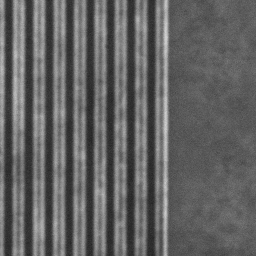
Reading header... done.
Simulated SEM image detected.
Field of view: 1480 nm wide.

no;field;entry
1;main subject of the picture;parallel lines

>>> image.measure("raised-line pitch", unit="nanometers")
118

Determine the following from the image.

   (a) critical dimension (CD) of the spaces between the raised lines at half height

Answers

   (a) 70 nm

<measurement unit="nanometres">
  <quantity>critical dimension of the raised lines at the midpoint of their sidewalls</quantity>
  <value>49.8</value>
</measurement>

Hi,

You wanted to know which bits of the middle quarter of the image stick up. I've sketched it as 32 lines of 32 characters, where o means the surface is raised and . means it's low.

...oo...oo...oo...oo...oo.......
...oo...oo...oo...oo...oo.......
...oo...oo...oo...oo...oo.......
...oo...oo...oo...oo...oo.......
...oo...oo...oo...oo...oo.......
...oo...oo...oo...oo...oo.......
...oo...oo...oo...oo...oo.......
...oo...oo...oo...oo...oo.......
...oo...oo...oo...oo...oo.......
...oo...oo...oo...oo...oo.......
...oo...oo...oo...oo...oo.......
...oo...oo...oo...oo...oo.......
...oo...oo...oo...oo...oo.......
...oo...oo...oo...oo...oo.......
...oo...oo...oo...oo...oo.......
...oo...oo...oo...oo...oo.......
...oo...oo...oo...oo...oo.......
...oo...oo...oo...oo...oo.......
...oo...oo...oo...oo...oo.......
...oo...oo...oo...oo...oo.......
...oo...oo...oo...oo...oo.......
...oo...oo...oo...oo...oo.......
...oo...oo...oo...oo...oo.......
...oo...oo...oo...oo...oo.......
...oo...oo...oo...oo...oo.......
...oo...oo...oo...oo...oo.......
...oo...oo...oo...oo...oo.......
...oo...oo...oo...oo...oo.......
...oo...oo...oo...oo...oo.......
...oo...oo...oo...oo...oo.......
...oo...oo...oo...oo...oo.......
...oo...oo...oo...oo...oo.......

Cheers